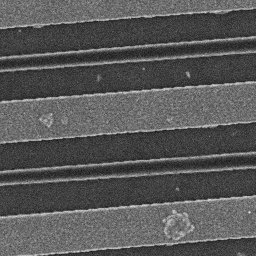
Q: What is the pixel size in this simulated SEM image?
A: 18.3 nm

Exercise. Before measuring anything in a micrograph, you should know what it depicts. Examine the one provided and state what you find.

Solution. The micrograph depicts lines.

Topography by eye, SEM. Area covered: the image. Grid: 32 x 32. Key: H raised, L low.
HHHHHHHHHHHHHHHHHHHHHHHHHHHHHHHH
HHHHHHHHHHHHHHHHHHHHHHHHHHLLLLLL
HHHHHHHHHHHHHHLLLLLLLLLLLLLLLLLL
HLLLLLLLLLLLLLLLLLLLLLLLLLLLLLLL
LLLLLLLLLLLLLLLLLLLLLLLLLLLLLLLL
LLLLLLLLLLLLLLLLLLLLLHHHHHHHHHHH
LLLLLLLLHHHHHHHHHHHHHHHHHHHHHHHH
HHHHHHHHHHHHHHHHHHHLLLLLLLLLLLLL
HHHHHHLLLLLLLLLLLLLLLLLLLLLLLLLL
LLLLLLLLLLLLLLLLLLLLLLLLLLLLLLLL
LLLLLLLLLLLLLLLLLLLLLLLLLLLLHHHH
LLLLLLLLLLLLLLLLLHHHHHHHHHHHHHHH
LLLHHHHHHHHHHHHHHHHHHHHHHHHHHHHH
HHHHHHHHHHHHHHHHHHHHHHHHHHHHHHHH
HHHHHHHHHHHHHHHHHHHHHHHHHHHHHHHH
HHHHHHHHHHHHHHHHHHHHHHHHHHHHHLLL
HHHHHHHHHHHHHHHHLLLLLLLLLLLLLLLL
HHHHHLLLLLLLLLLLLLLLLLLLLLLLLLLL
LLLLLLLLLLLLLLLLLLLLLLLLLLLLLLLL
LLLLLLLLLLLLLLLLLLLLLLLLLHHHHHHH
LLLLLLLLLLLLLHHHHHHHHHHHHHHHHHHH
HHHHHHHHHHHHHHHHHHHHHHHLLLLLLLLL
HHHHHHHHLLLLLLLLLLLLLLLLLLLLLLLL
LLLLLLLLLLLLLLLLLLLLLLLLLLLLLLLL
LLLLLLLLLLLLLLLLLLLLLLLLLLLLLLLL
LLLLLLLLLLLLLLLLLLLLHHHHHHHHHHHH
LLLLLLLLHHHHHHHHHHHHHHHHHHHHHHHH
HHHHHHHHHHHHHHHHHHHHHHHHHHHHHHHH
HHHHHHHHHHHHHHHHHHHHHHHHHHHHHHHH
HHHHHHHHHHHHHHHHHHHHHHHHHHHHHHHH
HHHHHHHHHHHHHHHHHHHHHLLLLLLLLLLL
HHHHHHHHHLLLLLLLLLLLLLLLLLLLLLLL